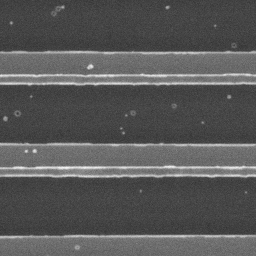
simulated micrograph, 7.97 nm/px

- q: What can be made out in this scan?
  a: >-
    lines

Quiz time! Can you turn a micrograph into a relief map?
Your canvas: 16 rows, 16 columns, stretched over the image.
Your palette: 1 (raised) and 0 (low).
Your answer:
0000000000000000
0000000000000000
0000000000000000
1111111111111111
1111111111111111
0000000000000000
0000000000000000
0000000000000000
0000000000000000
1111111111111111
1111111111111111
0000000000000000
0000000000000000
0000000000000000
0000000000000000
1111111111111111